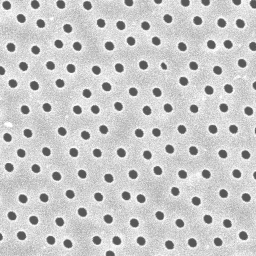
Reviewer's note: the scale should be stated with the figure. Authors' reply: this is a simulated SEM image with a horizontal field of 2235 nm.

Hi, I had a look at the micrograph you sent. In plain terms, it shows a regular array of holes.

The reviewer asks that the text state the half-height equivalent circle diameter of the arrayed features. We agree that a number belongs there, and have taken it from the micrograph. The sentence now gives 81.8 nanometres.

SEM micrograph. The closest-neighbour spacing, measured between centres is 20.3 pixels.